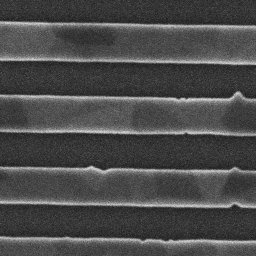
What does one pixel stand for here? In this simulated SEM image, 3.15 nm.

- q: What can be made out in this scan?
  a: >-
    one or a few lines or trenches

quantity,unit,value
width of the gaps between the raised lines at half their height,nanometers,110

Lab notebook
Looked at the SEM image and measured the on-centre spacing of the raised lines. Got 227 nanometers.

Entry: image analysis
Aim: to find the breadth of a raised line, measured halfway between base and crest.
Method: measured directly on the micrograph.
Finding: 36.7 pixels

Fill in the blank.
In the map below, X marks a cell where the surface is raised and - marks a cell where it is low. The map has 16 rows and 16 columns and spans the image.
----------------
XXXX-XX---------
XXXXXXXXXXXXXXXX
XXXXXXXXXXXXXXXX
----------------
----------------
XXXXXXXXXXXXXXXX
XXXXXXXXXXXXXXXX
----------------
----------------
-X--------------
XXXXXXXXXXXXXXXX
XXXXXXXXXXXXXXXX
----------------
----------------
XXXXXXXXXXXXXXXX